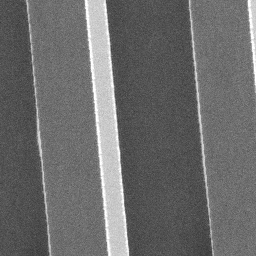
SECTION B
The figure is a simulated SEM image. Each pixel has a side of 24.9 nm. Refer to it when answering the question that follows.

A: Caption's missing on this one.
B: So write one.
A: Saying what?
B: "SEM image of lines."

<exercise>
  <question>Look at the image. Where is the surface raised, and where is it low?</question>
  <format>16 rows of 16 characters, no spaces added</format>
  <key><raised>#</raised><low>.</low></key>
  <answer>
..#####.....####
..#####.....####
..#####.....####
..#####.....####
..#####.....####
..#####.....####
..#####.....####
..#####......###
..#####......###
...####......###
...#####.....###
...#####.....###
...#####.....###
...#####.....###
...#####.....###
...#####.....###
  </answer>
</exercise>